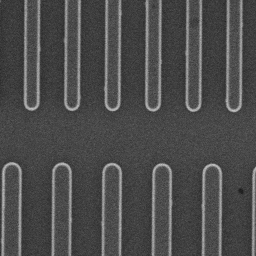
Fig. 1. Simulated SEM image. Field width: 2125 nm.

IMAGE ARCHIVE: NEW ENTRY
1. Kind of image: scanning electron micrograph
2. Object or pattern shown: groups of lines, slits or small figures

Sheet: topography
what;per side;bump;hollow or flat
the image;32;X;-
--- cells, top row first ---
---XX---XX---XX---XX---XX----X--
---XX---XX---XX---XX---XX----X--
---XX---XX---XX---XX---XX---XX--
---XX---XX---XX---XX---XX---XX--
---XX---XX---XX---XX---XX---XX--
---XX---XX---XX---XX---XX---XX--
---XX---XX---XX---XX---XX---XX--
---XX---XX---XX---XX---XX---XX--
---XX---XX---XX---XX---XX---XX--
---XX---XX---XX---XX---XX---XX--
---XX---XX---XX---XX---XX---XX--
---XX---XX---XX---XX---XX---XX--
---XX---XX---XX---XX---XX---XX--
--------------X----X----X----X--
--------------------------------
--------------------------------
--------------------------------
--------------------------------
--------------------------------
--------------------------------
-X-----X------------------------
XXX----XX----XX----XX----XXX----
XXX----XX----XX----XX----XXX----
XXX----XX----XX----XX----XXX----
XXX----XX----XX----XX----XXX----
XXX----XX----XX----XX----XXX----
XXX----XX----XX----XX----XXX----
XXX----XX----XX----XX----XX-----
XXX----XX----XX----XX----XX-----
XXX----XX----XX----XX----XX-----
XXX----XX----XX----XX----XX-----
XX-----XX----XX----XX----XX-----